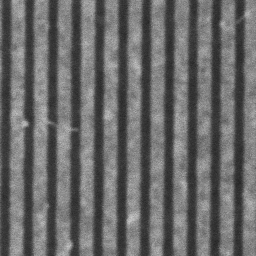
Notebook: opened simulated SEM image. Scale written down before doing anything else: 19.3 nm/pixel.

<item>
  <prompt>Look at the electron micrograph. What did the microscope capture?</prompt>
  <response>wiring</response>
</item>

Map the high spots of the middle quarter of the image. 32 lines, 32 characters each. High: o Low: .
o....oo...ooo...ooo...ooo...ooo.
o...ooo...ooo...ooo...ooo...ooo.
o...ooo...ooo...ooo...ooo...ooo.
o...ooo...ooo...ooo...ooo...ooo.
o...ooo...ooo...ooo...ooo...ooo.
o...ooo...ooo...ooo...ooo...ooo.
o...ooo...ooo...ooo...ooo...ooo.
o...ooo...ooo...ooo...ooo...ooo.
o...ooo...ooo...ooo...ooo...ooo.
o...ooo...ooo...ooo...ooo...ooo.
o...ooo...ooo...ooo...ooo...ooo.
o...ooo...ooo...ooo...ooo...ooo.
o...ooo...ooo...ooo...ooo...ooo.
o...ooo...ooo...ooo...ooo...ooo.
o...ooo...ooo...ooo...ooo...ooo.
o...ooo...ooo...ooo...ooo...ooo.
oo..ooo...ooo...ooo...ooo...ooo.
o...ooo...ooo...ooo...ooo...ooo.
o...ooo...ooo...ooo...ooo...ooo.
o...ooo...ooo...ooo...ooo...ooo.
o...ooo...ooo...ooo...ooo...ooo.
o...ooo...ooo...ooo...ooo...ooo.
o...ooo...ooo...ooo...ooo...ooo.
o...ooo...ooo...ooo...ooo...ooo.
o...ooo...ooo...ooo...ooo...ooo.
o...ooo...ooo...ooo...ooo...ooo.
o...ooo...ooo...ooo...ooo...ooo.
o...ooo...ooo...ooo...ooo...oo..
o...ooo...ooo...ooo...ooo...oo..
o...ooo...ooo...ooo...ooo...oo..
o...ooo...ooo...ooo...ooo...ooo.
o...ooo...ooo...ooo...ooo...ooo.